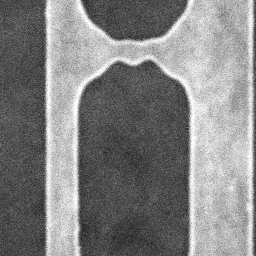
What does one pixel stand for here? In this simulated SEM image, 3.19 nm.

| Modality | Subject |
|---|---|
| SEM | one or a few lines or trenches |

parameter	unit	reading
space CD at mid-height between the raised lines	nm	365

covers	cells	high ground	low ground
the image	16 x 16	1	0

0001100000001111
0001110000011111
0001111000111111
0001111111111111
0001110000111111
0001100000001111
0001100000001111
0001100000001111
0001100000001111
0001100000001111
0001100000001111
0001100000001111
0001100000001111
0001100000001111
0001100000001111
0001100000001111